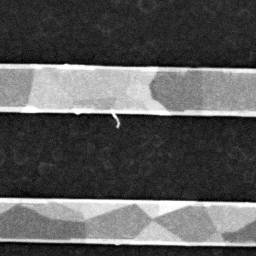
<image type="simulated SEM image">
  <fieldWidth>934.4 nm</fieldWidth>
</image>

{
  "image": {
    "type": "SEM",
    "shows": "one or a few lines or trenches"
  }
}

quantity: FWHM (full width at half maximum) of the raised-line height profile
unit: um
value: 0.161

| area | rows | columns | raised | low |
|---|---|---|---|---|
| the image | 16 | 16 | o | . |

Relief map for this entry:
................
................
................
................
oooooooooooooooo
oooooooooooooooo
oooooooooooooooo
................
................
................
................
................
o.o.............
oooooooooooooooo
oooooooooooooooo
................